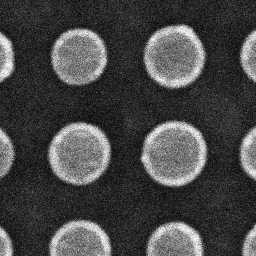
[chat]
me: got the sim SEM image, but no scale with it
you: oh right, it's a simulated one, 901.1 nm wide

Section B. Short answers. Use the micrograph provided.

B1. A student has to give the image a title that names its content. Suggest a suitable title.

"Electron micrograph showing raised bodies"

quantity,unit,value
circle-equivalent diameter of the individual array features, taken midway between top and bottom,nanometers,212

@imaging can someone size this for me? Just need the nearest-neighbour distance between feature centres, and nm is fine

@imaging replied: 334